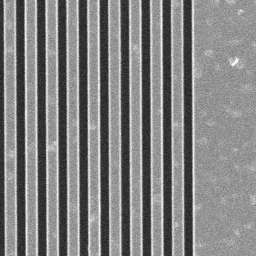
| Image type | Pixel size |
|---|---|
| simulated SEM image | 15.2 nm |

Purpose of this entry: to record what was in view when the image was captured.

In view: parallel lines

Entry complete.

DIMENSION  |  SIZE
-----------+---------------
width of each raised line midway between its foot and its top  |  183 nm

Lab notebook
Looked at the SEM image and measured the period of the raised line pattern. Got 0.318 µm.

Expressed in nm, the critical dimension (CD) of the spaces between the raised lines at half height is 141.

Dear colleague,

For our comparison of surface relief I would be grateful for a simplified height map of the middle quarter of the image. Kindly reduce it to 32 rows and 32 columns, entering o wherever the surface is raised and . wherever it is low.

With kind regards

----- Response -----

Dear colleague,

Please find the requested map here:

.ooo..ooo..ooo...oo...oo...ooo..
.ooo..ooo..ooo...oo...oo...ooo..
.ooo..ooo..ooo...oo...oo...ooo..
.ooo..ooo..ooo...oo...oo...ooo..
.ooo..ooo..ooo...oo...oo...ooo..
.ooo..ooo..ooo...oo...oo...ooo..
.ooo..ooo..ooo...oo...oo...ooo..
.ooo..ooo..ooo...oo...oo...ooo..
.ooo..ooo..ooo...oo...oo...ooo..
.ooo..ooo..ooo...oo...oo...ooo..
.ooo..ooo..ooo...oo...oo...ooo..
.ooo..ooo..ooo...oo...oo...ooo..
.ooo..ooo..ooo...oo...oo...ooo..
.ooo..ooo..ooo...oo...oo...ooo..
.ooo..ooo..ooo...oo...oo...ooo..
.ooo..ooo..ooo...oo...oo...ooo..
.ooo..ooo..ooo...oo...oo...ooo..
.ooo..ooo..ooo...oo...oo...ooo..
.ooo..ooo..ooo...oo...oo...ooo..
.ooo..ooo..ooo...oo...oo...ooo..
.ooo..ooo..ooo...oo...oo...ooo..
.ooo..ooo..ooo...oo...oo...ooo..
.ooo..ooo..ooo...oo...oo...ooo..
.ooo..ooo..ooo...oo...oo...ooo..
.ooo..ooo..ooo...oo...ooo..ooo..
.ooo..ooo..ooo...oo...ooo..ooo..
.ooo..ooo..ooo...oo...ooo..ooo..
.ooo..ooo..ooo...oo...ooo..ooo..
.ooo..ooo..ooo...oo...ooo..ooo..
.ooo..ooo..ooo...oo...ooo..ooo..
.ooo..ooo..ooo...oo...ooo..ooo..
.ooo..ooo..ooo...oo...ooo..ooo..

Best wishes